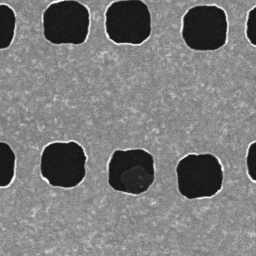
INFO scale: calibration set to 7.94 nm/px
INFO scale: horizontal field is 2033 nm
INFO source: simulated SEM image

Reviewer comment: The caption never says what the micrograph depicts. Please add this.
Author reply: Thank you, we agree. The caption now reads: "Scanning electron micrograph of holes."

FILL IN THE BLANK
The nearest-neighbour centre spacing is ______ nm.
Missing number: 541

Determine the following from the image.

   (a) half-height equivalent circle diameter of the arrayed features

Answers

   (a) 0.373 microns